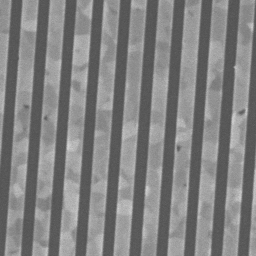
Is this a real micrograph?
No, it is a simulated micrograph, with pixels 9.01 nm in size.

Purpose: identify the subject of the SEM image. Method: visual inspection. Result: parallel lines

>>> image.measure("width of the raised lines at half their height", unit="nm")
138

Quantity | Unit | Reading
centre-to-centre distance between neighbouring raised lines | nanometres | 244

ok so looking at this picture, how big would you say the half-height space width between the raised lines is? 106 nm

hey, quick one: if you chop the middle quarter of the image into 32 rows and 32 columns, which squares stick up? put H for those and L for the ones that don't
LLHHHHLLLHHHHLLLHHHLLLLHHHLLLHHH
LLHHHHLLLHHHHLLLHHHLLLLHHHLLLHHH
LLHHHHLLLHHHHLLLHHHLLLLHHHLLLHHH
LLHHHHLLLHHHHLLLHHHLLLHLLHLLLHHH
LLHHHHLLLHHHLLLLHHHLLLHHHHLLLHHH
LLHHHHLLLHHHLLLLHHHLLLHHHHLLLHHH
LLHHHHLLLHHHLLLHHHHLLLHHHHLLLHHH
LLHHHLLLHHHHLLLHHHHLLLHHHHLLLHHH
LLHHHLLLHHHHLLLHHHHLLLHHHHLLLHHH
LLHHHLLLHHHHLLLHHHHLLLHHHHLLLHHH
LHHHHLLLHHHHLLLHHHHLLLHHHLLLLHHH
LHHHHLLLHLHHLLLHHHHLLLHHHLLLLHHH
LHHHHLLLHHHHLLLHHHHLLLHHHLLLHHHH
LHHHHLLLHHHHLLLHHHLLLLHHHLLLHHHH
LHHHHLLLHHHHLLLHHHLLLLHHHLLLHHHH
LHHHHLLLHHHHLLLHHLLLLLHHHLLLHHHL
LHHHHLLLHHHHLLLHHHLLLLHHHLLLHHHH
LHHHHLLLHHHHLLLHHHLLLHHHHLLLHHHH
LHHHHLLLHHHLLLLHHHLLLHHHHLLLHHHH
LHHHHLLLHHHLLLLHHHLLLHHHHLLLLHHH
LHHHHLLLHHHLLLHHHHLLLHHHHLLLLLHH
LHHHLLLHHHHLLLHHHHLLLHHHHLLLLLHH
LHHHLLLHHHHLLLHHHHLLLHHHHLLLHHHH
LHHHLLLHHHHLLLHHHHLLLHHHHLLLHHHL
HHHHLLLHHHHLLLHHHHLLLHHHHLLLHHHL
HHHHLLLHHHHLLLHHHHLLLHHHLLLLHHHL
HHHHLLLHHHHLLLHHHHLLLHHHLLLHHHHL
HHHHLLLHHHHLLLHHHHLLLHHHLLLHHHHL
HHHHLLLHHHHLLLHHHLLLLHHHLLLHHHHL
HHHHLLLHHHHLLLHHHLLLLHHHLLLHHHHL
HHHHLLLHHHHLLLHHHLLLLHHHLLLHHLLL
HHHHLLLHHHHLLLHHHLLLHHHHLLLHHLHL